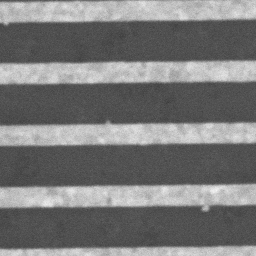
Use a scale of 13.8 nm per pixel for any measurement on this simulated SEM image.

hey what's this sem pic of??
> wiring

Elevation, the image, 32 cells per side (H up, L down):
HHHHHHHHHHHHHHHHHHHHHHHHHHHHHHHH
HHHHHHHHHHHHHHHHHHHHHHHHHHHHHHHH
HHHHHHHHHHHLLHHHLLLLLLLLLLLLLLLL
LLLLLLLLLLLLLLLLLLLLLLLLLLLLLLLL
LLLLLLLLLLLLLLLLLLLLLLLLLLLLLLLL
LLLLLLLLLLLLLLLLLLLLLLLLLLLLLLLL
LLLLLLLLLLLLLLLLLLLLLLLLLLLLLLLL
LLLLLLLLLLLLLLLLLLLLLLLLLLLLLLLL
HHHHHHHHHHHHHHHHHHHHHHHHHHHHHHHH
HHHHHHHHHHHHHHHHHHHHHHHHHHHHHHHH
LLLLLLLLLLLLLLLLLLLLLLLLLLLLLLLL
LLLLLLLLLLLLLLLLLLLLLLLLLLLLLLLL
LLLLLLLLLLLLLLLLLLLLLLLLLLLLLLLL
LLLLLLLLLLLLLLLLLLLLLLLLLLLLLLLL
LLLLLLLLLLLLLLLLLLLLLLLLLLLLLLLL
LLLLLLLLLLLLLLLLLLLLLLHHHHHHHHHH
HHHHHHHHHHHHHHHHHHHHHHHHHHHHHHHH
HHHHHHHHHHHHHHHHHHHHHHHHHHHHHHHH
LLLLLLLLLLLLLLLLLLLLLLLLLLLLLLLL
LLLLLLLLLLLLLLLLLLLLLLLLLLLLLLLL
LLLLLLLLLLLLLLLLLLLLLLLLLLLLLLLL
LLLLLLLLLLLLLLLLLLLLLLLLLLLLLLLL
LLLLLLLLLLLLLLLLLLLLLLLLLLLLLLLL
LLLLHHHHHHHHHHHHHHHHHHHHHHHHHHHH
HHHHHHHHHHHHHHHHHHHHHHHHHHHHHHHH
HHHHHHHHHHHHHHHHHHHHHHHHHHHHHHLH
LLLLLLLLLLLLLLLLLLLLLLLLLLLLLLLL
LLLLLLLLLLLLLLLLLLLLLLLLLLLLLLLL
LLLLLLLLLLLLLLLLLLLLLLLLLLLLLLLL
LLLLLLLLLLLLLLLLLLLLLLLLLLLLLLLL
LLLLLLLLLLLLLLLLLLLLLLLLLLLLLLLL
HHHHHHHHHHHHHHHHHHHHHHHHHHHHHHHH